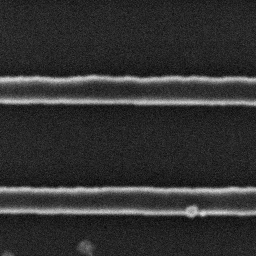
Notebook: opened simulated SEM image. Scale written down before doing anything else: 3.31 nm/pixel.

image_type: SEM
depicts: lines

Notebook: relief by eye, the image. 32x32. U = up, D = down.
DDDDDDDDDDDDDDDDDDDDDDDDDDDDDDDD
DDDDDDDDDDDDDDDDDDDDDDDDDDDDDDDD
DDDDDDDDDDDDDDDDDDDDDDDDDDDDDDDD
DDDDDDDDDDDDDDDDDDDDDDDDDDDDDDDD
DDDDDDDDDDDDDDDDDDDDDDDDDDDDDDDD
DDDDDDDDDDDDDDDDDDDDDDDDDDDDDDDD
DDDDDDDDDDDDDDDDDDDDDDDDDDDDDDDD
DDDDDDDDDDDDDDDDDDDDDDDDDDDDDDDD
DDDDDDDDDDDDDDDDDDDDDDDDDDDDDDDD
DDDDDDDDDDDDDDDDDDDDDDDDDDDDDDDD
UUUUUUUUUUUUUUUUUUUUUUUUUUUUUUUU
UUUUUUUUUUUUUUUUUUUUUUUUUUUUUUUU
UUUUUUUUUUUUUUUUUUUUUUUUUUUUUUUU
DDDDDDDDDDDDDDDDDDDDDDDDDDDDDDDD
DDDDDDDDDDDDDDDDDDDDDDDDDDDDDDDD
DDDDDDDDDDDDDDDDDDDDDDDDDDDDDDDD
DDDDDDDDDDDDDDDDDDDDDDDDDDDDDDDD
DDDDDDDDDDDDDDDDDDDDDDDDDDDDDDDD
DDDDDDDDDDDDDDDDDDDDDDDDDDDDDDDD
DDDDDDDDDDDDDDDDDDDDDDDDDDDDDDDD
DDDDDDDDDDDDDDDDDDDDDDDDDDDDDDDD
DDDDDDDDDDDDDDDDDDDDDDDDDDDDDDDD
DDDDDDDDDDDDDDDDDDDDDDDDDDDDDDDD
UDDUDDDDDDDDUUUUUUUDDDDDDDDDDUDU
UUUUUUUUUUUUUUUUUUUUUUUUUUUUUUUU
UUUUUUUUUUUUUUUUUUUUUUUUUUUUUUUU
UUUUUUUUUUUUUUUUUUUUUUUUUUUUUUUU
DDDDDDDDDDDDDDDDDDDDDDDDDDDDDDDD
DDDDDDDDDDDDDDDDDDDDDDDDDDDDDDDD
DDDDDDDDDDDDDDDDDDDDDDDDDDDDDDDD
DDDDDDDDDDDDDDDDDDDDDDDDDDDDDDDD
DDDDDDDDDDDDDDDDDDDDDDDDDDDDDDDD